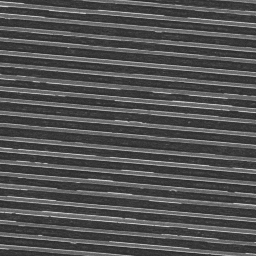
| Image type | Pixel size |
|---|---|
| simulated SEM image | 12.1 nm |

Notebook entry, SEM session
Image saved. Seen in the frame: parallel lines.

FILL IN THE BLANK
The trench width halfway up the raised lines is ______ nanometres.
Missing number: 106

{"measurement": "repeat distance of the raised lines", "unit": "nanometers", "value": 146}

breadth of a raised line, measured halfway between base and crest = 0.0468 um